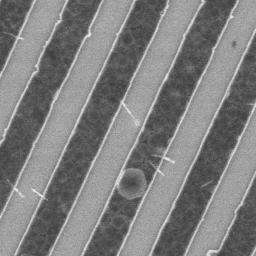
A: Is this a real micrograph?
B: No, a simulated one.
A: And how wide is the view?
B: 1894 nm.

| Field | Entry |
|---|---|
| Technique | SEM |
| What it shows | parallel lines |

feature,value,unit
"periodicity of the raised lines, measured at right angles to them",0.451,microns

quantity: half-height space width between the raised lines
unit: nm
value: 210